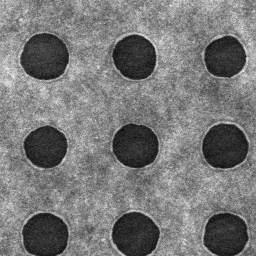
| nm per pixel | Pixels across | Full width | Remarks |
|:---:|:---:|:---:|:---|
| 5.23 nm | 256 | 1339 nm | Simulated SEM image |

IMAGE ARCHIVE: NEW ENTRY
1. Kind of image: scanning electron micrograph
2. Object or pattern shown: holes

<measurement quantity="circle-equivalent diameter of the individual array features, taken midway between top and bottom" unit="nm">241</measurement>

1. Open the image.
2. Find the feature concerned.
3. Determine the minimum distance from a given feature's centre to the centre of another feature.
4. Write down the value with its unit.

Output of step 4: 0.468 micrometres